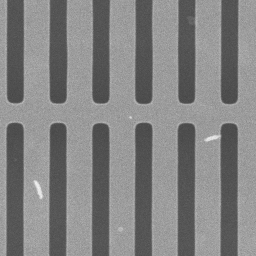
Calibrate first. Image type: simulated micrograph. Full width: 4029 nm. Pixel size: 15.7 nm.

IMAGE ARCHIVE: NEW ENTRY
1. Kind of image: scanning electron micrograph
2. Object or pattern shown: groups of lines, slits or small figures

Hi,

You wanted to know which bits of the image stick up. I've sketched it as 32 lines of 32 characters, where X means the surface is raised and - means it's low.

X--XXX--XXXX--XXX--XXX--XXXX--XX
X--XXX--XXXX--XXX--XXX--XXXX--XX
X--XXX--XXXX--XXX--XXX--XXXX--XX
X--XXX--XXXX--XXX--XXX--XXXX--XX
X--XXX--XXXX--XXX--XXX--XXXX--XX
X--XXX--XXXX--XXX--XXX--XXXX--XX
X--XXX---XXX--XXX--XXX--XXXX--XX
X--XXX---XXX--XXX--XXX--XXXX--XX
X--XXX---XXX--XXX--XXX--XXXX--XX
X--XXX--XXXX--XXX--XXX--XXXX--XX
X--XXX--XXX---XXX--XXX--XXXX--XX
X--XXX--XXXX--XXX--XXX--XXXX--XX
X--XXX--XXXX--XXX--XXX--XXXX--XX
XXXXXXXXXXXXXXXXXXXXXXXXXXXXXXXX
XXXXXXXXXXXXXXXXXXXXXXXXXXXXXXXX
X-XXXXX-XXXX-XXXX--XXXX-XXXX-XXX
X--XXX--XXXX--XXX--XXX--XXXX--XX
X--XXX--XXX---XXX--XXX--XXX---XX
X--XXX--XXX---XXX--XXX--XXX---XX
X--XXX--XXX---XXX--XXX--XXX---XX
X--XXX--XXX---XXX--XXX--XXX---XX
X--XXX--XXX---XXX--XXX--XXX---XX
X--XXX--XXX---XXX--XXX--XXX---XX
X--XXX--XXX---XXX--XXX--XXXX--XX
X--XXX--XXX---XXX--XXX--XXXX--XX
X--XXX--XXX---XXX--XXX--XXXX--XX
X--XXX--XXX---XXX--XXX--XXXX--XX
X--XXX--XXX---XXX--XXX--XXX---XX
X--XXX--XXX---XXX--XXX--XXX---XX
X--XXX--XXX---XXX--XXX--XXX---XX
X--XXX--XXX---XXX--XXX--XXX---XX
X--XXX--XXX---XXX--XXX--XXX---XX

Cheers